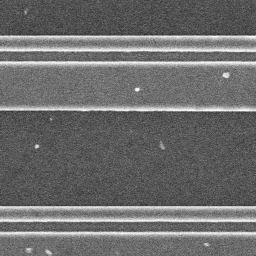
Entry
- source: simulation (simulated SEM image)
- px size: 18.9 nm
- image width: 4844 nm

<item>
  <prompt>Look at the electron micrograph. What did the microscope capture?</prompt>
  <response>lines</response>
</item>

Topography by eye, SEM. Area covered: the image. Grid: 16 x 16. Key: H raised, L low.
LLLLLLLLLLLLLLLL
LLLLLLLLLLLLLLLL
HHHHHHHHHHHHHHHH
HHHHHHHHHHHHHHHH
HHHHHHHHHHHHHHHH
HHHHHHHHHHHHHHHH
HHHHHHHHHHHHHHHH
LLLLLLLLLLLLLLLL
LLLLLLLLLLLLLLLL
LLLLLLLLLLLLLLLL
LLLLLLLLLLLLLLLL
LLLLLLLLLLLLLLLL
LLLLLLLLLLLLLLLL
HHHHHHHHHHHHHHHH
HHHHHHHHHHHHHHHH
HHHHHHHHHHHHHHHH